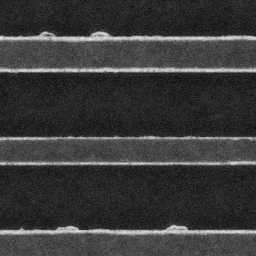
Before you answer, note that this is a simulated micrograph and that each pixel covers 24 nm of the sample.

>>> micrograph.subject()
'lines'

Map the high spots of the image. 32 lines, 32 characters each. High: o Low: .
................................
................................
................................
................................
................................
oooooooooooooooooooooooooooooooo
oooooooooooooooooooooooooooooooo
oooooooooooooooooooooooooooooooo
oooooooooooooooooooooooooooooooo
................................
................................
................................
................................
................................
................................
................................
................................
oooooooooooooooooooooooooooooooo
oooooooooooooooooooooooooooooooo
oooooooooooooooooooooooooooooooo
........o.......................
................................
................................
................................
................................
................................
................................
................................
................................
oooooooooooooooooooooooooooooooo
oooooooooooooooooooooooooooooooo
oooooooooooooooooooooooooooooooo